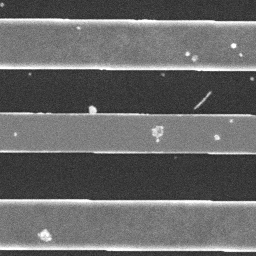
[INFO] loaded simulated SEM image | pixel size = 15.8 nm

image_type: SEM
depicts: lines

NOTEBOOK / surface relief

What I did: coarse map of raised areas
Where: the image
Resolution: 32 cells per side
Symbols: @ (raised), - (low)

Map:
--------------------------------
--------------------------------
@@@@@@@@@-----------------------
@@@@@@@@@@@@@@@@@@@@@@@@@@@@@@@@
@@@@@@@@@@@@@@@@@@@@@@@@@@@@@@@@
@@@@@@@@@@@@@@@@@@@@@@@@@@@@@@@@
@@@@@@@@@@@@@@@@@@@@@@@@@@@@@@@@
@@@@@@@@@@@@@@@@@@@@@@@@@@@@@@@@
@@@@@@@@@@@@@@@@@@@@@@@@@@@@@@@@
--------------------------------
--------------------------------
--------------------------------
--------------------------------
--------------------------------
@@@@@@@@@@@@@@@@@@@@@@@@@@@@@@@@
@@@@@@@@@@@@@@@@@@@@@@@@@@@@@@@@
@@@@@@@@@@@@@@@@@@@@@@@@@@@@@@@@
@@@@@@@@@@@@@@@@@@@@@@@@@@@@@@@@
@@@@@@@@@@@@@@@@@@@@@@@@@@@@@@@@
--------------------------------
--------------------------------
--------------------------------
--------------------------------
--------------------------------
--------------------------------
@@@@@@@@@@@@@@@@@@@@@@@@@@@@@@@@
@@@@@@@@@@@@@@@@@@@@@@@@@@@@@@@@
@@@@@@@@@@@@@@@@@@@@@@@@@@@@@@@@
@@@@@@@@@@@@@@@@@@@@@@@@@@@@@@@@
@@@@@@@@@@@@@@@@@@@@@@@@@@@@@@@@
@@@@@@@@@@@@@@@@@@@@@@@@@@@@@@@@
--------------------------------